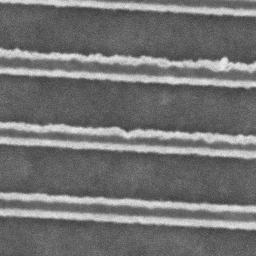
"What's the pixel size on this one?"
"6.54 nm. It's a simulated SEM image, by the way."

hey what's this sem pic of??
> one or a few lines or trenches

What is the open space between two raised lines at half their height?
352 nm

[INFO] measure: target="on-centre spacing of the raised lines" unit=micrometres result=0.463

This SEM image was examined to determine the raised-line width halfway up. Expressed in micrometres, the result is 0.113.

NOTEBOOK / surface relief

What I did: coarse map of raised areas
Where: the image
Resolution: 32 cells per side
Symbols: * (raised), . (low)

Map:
...........*********************
.............................***
................................
................................
................................
................................
................................
****************.**.............
********************************
...........*.*******************
.............................***
................................
................................
................................
................................
................................
***************.................
********************************
................****************
................................
................................
................................
................................
................................
*...............................
*******************.............
********************************
................*.**************
................................
................................
................................
................................